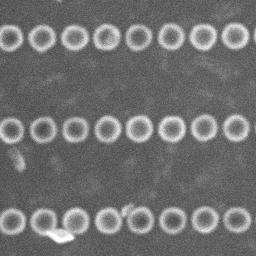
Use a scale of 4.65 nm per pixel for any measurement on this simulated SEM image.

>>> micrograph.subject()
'a regular array of raised bodies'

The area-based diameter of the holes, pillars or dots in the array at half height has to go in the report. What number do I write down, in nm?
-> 117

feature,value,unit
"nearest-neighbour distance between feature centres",148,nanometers